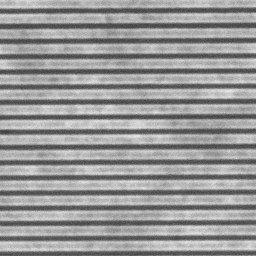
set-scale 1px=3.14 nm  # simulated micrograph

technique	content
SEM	parallel lines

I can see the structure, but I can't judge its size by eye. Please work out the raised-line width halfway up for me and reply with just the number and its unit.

25.5 nanometres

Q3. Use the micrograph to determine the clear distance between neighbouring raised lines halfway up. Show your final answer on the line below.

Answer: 0.0224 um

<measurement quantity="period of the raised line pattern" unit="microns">0.0476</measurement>